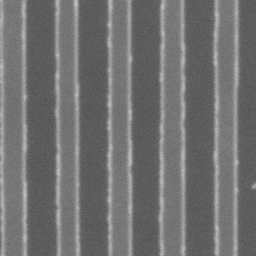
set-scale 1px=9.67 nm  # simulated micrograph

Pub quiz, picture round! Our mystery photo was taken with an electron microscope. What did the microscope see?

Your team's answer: lines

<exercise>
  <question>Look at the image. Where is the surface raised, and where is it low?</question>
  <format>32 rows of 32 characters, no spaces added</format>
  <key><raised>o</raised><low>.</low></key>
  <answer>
ooo....ooo....oo....ooo....ooo..
ooo....ooo....oo....ooo....ooo..
ooo....ooo....oo....ooo....ooo..
ooo....ooo....oo....ooo....ooo..
ooo....ooo....oo....ooo....ooo..
ooo....ooo....oo....ooo....ooo..
ooo....ooo....oo....ooo....ooo..
ooo....ooo....oo....ooo....ooo..
ooo....ooo....oo....ooo....ooo..
ooo....ooo....oo....ooo....ooo..
ooo....ooo....oo....ooo....ooo..
ooo....ooo....oo....ooo....oo...
ooo....ooo....oo....ooo....oo...
ooo....ooo....oo....ooo....oo...
ooo....ooo....oo....ooo....oo...
ooo....ooo....oo....ooo....oo...
ooo....ooo....oo....ooo....oo...
ooo....ooo....oo....ooo....oo...
ooo....ooo....oo....ooo....oo...
ooo....ooo....oo....ooo....oo...
ooo....ooo....oo....ooo....ooo..
ooo....ooo....oo....ooo....oo...
ooo....ooo....oo....ooo....oo...
ooo....ooo....oo....ooo....ooo..
ooo....ooo....oo....ooo....oo...
ooo....ooo....oo....ooo....oo...
ooo....ooo....oo....ooo....oo...
ooo....ooo....oo....ooo....oo...
ooo....ooo....oo....ooo....oo...
ooo....ooo....oo....ooo....oo...
ooo....ooo....oo....ooo....oo...
ooo....ooo....oo....ooo....oo...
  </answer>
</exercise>